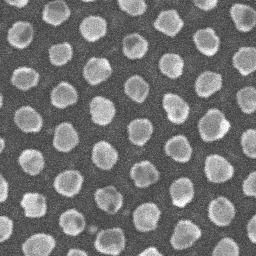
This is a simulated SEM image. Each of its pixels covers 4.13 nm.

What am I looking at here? a regular array of raised bodies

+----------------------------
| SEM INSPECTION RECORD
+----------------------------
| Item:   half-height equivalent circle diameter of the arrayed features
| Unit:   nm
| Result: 103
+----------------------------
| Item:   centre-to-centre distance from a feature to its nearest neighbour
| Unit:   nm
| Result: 171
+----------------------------